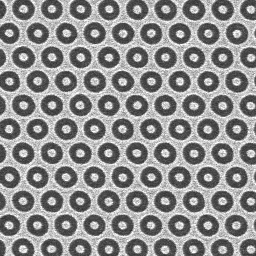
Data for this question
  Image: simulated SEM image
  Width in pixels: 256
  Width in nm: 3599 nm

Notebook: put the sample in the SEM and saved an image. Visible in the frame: a regular array of ring-shaped grooves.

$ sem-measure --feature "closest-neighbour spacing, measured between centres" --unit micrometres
0.388